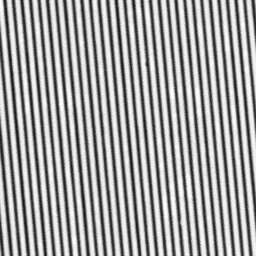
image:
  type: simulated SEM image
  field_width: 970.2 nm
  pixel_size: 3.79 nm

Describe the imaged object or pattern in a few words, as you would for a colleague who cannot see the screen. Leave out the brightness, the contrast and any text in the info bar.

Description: parallel lines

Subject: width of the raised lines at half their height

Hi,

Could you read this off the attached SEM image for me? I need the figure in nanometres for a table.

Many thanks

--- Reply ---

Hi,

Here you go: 17.5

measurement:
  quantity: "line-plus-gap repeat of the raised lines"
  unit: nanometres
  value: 32.3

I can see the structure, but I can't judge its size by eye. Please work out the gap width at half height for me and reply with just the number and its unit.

13.7 nm